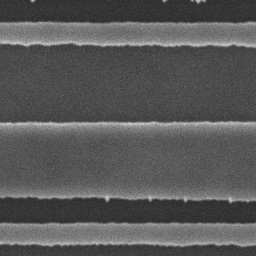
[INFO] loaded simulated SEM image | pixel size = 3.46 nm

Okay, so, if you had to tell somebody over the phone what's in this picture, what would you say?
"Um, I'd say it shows lines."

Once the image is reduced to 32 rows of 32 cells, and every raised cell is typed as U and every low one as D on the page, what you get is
DDDDDDDDDDDDDDDDDDDDDDDDDDDDDDDD
DDDDDDDDDDDDDDDDDDDDDDDDDDDDDDDD
DDDDDDDDDDDDDDDDDDDDDDDDDDDDDDDD
UUUUUUUUUUUUUUUUUUUUUUUUUUUUUUUU
UUUUUUUUUUUUUUUUUUUUUUUUUUUUUUUU
DDUUDUUDDUUUUUUUUUUUUUUUUUUUUUUU
DDDDDDDDDDDDDDDDDDDDDDDDDDDDDDDD
DDDDDDDDDDDDDDDDDDDDDDDDDDDDDDDD
DDDDDDDDDDDDDDDDDDDDDDDDDDDDDDDD
DDDDDDDDDDDDDDDDDDDDDDDDDDDDDDDD
DDDDDDDDDDDDDDDDDDDDDDDDDDDDDDDD
DDDDDDDDDDDDDDDDDDDDDDDDDDDDDDDD
DDDDDDDDDDDDDDDDDDDDDDDDDDDDDDDD
DDDDDDDDDDDDDDDDDDDDDDDDDDDDDDDD
DDDDDDDDDDDDDDDDDDDDDDDDDDDDDDDD
UUUUUUUDUUUUUUUUUUUUUUUUUUUUUUUU
UUUUUUUUUUUUUUUUUUUUUUUUUUUUUUUU
UUUUUUUUUUUUUUUUUUUUUUUUUUUUUUUU
UUUUUUUUUUUUUUUUUUUUUUUUUUUUUUUU
UUUUUUUUUUUUUUUUUUUUUUUUUUUUUUUU
UUUUUUUUUUUUUUUUUUUUUUUUUUUUUUUU
UUUUUUUUUUUUUUUUUUUUUUUUUUUUUUUU
UUUUUUUUUUUUUUUUUUUUUUUUUUUUUUUU
UUUUUUUUUUUUUUUUUUUUUUUUUUUUUUUU
UUUUUUUUUUUUUUUUUUUUUUUUUUUUUUUU
DDDDDDDDDDDDDDDDDDDDDDDDDDDDDDDD
DDDDDDDDDDDDDDDDDDDDDDDDDDDDDDDD
DDDDDDDDDDDDDDDDDDDDDDDDDDDDDDDD
UUUUUUUUUUUUUUUUUUUUUUUUUUUUUUUU
UUUUUUUUUUUUUUUUUUUUUUUUUUUUUUUU
DDDUUUUUUUUDDUDDUDDUUUUUUUDUUUUU
DDDDDDDDDDDDDDDDDDDDDDDDDDDDDDDD